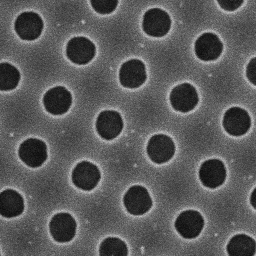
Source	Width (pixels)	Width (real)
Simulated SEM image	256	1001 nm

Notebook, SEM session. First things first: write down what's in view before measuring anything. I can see a regular array of holes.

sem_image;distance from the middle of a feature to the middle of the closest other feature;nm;219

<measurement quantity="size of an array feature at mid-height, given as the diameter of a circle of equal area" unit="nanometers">117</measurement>